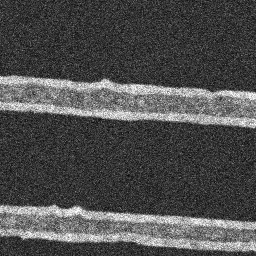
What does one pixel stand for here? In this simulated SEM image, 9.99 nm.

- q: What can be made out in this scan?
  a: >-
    one or a few lines or trenches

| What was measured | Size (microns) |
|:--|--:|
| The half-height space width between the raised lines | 1.03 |